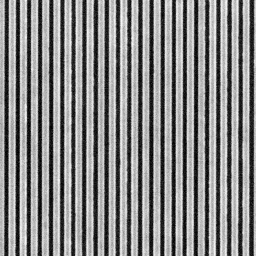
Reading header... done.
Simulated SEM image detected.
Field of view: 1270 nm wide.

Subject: parallel lines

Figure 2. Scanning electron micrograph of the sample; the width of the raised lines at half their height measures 27.9 nm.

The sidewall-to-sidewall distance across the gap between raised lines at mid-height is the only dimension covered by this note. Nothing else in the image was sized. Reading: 0.0279 micrometres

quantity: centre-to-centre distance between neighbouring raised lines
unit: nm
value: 55.2